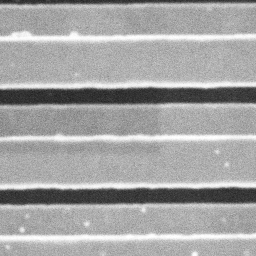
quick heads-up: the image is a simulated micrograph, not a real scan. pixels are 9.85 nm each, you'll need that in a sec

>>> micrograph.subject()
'lines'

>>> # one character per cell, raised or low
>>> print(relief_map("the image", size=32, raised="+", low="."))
................................
++++++++++++++++++++++++++++++++
++++++++++++++++++++++++++++++++
++++++++++++++++++++++++++++++++
++++++++++++++++++++++++++++++++
++++++++++++++++++++++++++++++++
++++++++++++++++++++++++++++++++
++++++++++++++++++++++++++++++++
++++++++++++++++++++++++++++++++
++++++++++++++++++++++++++++++++
++++++++++++++++++++++++++++++++
................................
................................
++++++++++++++++++++++++++++++++
++++++++++++++++++++++++++++++++
++++++++++++++++++++++++++++++++
++++++++++++++++++++++++++++++++
++++++++++++++++++++++++++++++++
++++++++++++++++++++++++++++++++
++++++++++++++++++++++++++++++++
++++++++++++++++++++++++++++++++
++++++++++++++++++++++++++++++++
++++++++++++++++++++++++++++++++
+++....+.+......................
................................
................................
++++++++++++++++++++++++++++++++
++++++++++++++++++++++++++++++++
++++++++++++++++++++++++++++++++
++++++++++++++++++++++++++++++++
++++++++++++++++++++++++++++++++
++++++++++++++++++++++++++++++++